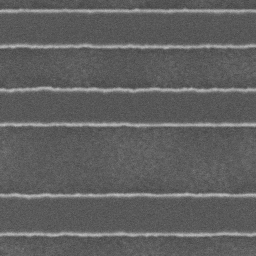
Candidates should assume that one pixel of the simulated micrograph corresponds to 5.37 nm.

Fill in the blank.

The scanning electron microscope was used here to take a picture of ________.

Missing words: lines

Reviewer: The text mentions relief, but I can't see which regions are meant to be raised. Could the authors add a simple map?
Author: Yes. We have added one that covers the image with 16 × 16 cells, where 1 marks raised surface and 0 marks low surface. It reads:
0000000000000000
1111111111111111
1111111111111111
0000000000000000
0000000000000000
0010000000000000
1111111111111111
1111111111111111
0000000000000000
0000000000000000
0000000000000000
0000000000000000
1111111111111111
1111111111111111
1111111111111111
0000000000000000